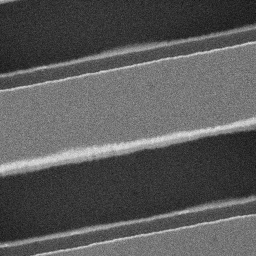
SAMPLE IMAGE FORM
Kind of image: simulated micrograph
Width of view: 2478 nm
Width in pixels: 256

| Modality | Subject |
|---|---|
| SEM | lines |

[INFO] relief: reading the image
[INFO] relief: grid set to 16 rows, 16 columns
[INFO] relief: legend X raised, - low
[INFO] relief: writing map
----------------
----------------
------------XXXX
-------XXXXXXXXX
-XXXXXXXXXXXXXXX
XXXXXXXXXXXXXXXX
XXXXXXXXXXXXXXXX
XXXXXXXXXXXXXXXX
XXXXXXXXXXXX----
XXXXXXX---------
XX--------------
----------------
----------------
-----------XXXXX
-----XXXXXXXXXXX
XXXXXXXXXXXXXXXX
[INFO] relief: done